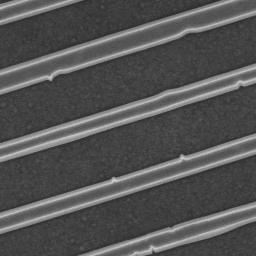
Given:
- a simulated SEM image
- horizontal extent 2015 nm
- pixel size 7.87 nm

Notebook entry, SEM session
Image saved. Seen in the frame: one or a few lines or trenches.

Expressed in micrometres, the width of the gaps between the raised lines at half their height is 0.403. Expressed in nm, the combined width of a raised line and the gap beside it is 527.